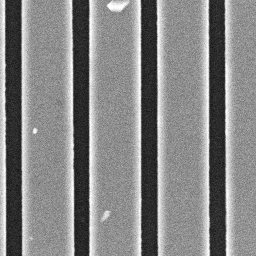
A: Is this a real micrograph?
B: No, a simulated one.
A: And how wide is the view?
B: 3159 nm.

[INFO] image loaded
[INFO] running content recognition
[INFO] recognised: lines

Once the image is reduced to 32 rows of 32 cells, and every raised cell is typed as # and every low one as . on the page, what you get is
#..######..#######..######..####
#..######..#######..######..####
#..######..#######..######..####
#..######..#######..######..####
#..######..#######..######..####
#..######..#######..######..####
#..######..#######..######..####
#..######..#######..######..####
#..######..#######..######..####
#..######..#######..######..####
#..######..#######..######..####
#..######..#######..######..####
#..######..#######..######..####
#..######..#######..######..####
#..######..#######..######..####
#..######..#######..######..####
#..######..#######..######..####
#..######..#######..######..####
#..######..#######..######..####
#..######..#######..######..####
#..######..#######..######..####
#..######..#######..######..####
#..######..#######..######..####
#..######..#######..######..####
#..######..#######..######..####
#..######..#######..######..####
#..######..#######..######..####
#..######..#######..######..####
#..######..#######..######..####
#..######..#######..######..####
#..######..#######..######..####
#..######..#######..######..####